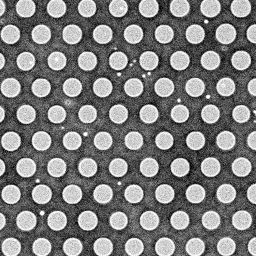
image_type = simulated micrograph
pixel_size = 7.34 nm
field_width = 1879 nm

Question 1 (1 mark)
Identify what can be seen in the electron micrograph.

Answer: an array of small figures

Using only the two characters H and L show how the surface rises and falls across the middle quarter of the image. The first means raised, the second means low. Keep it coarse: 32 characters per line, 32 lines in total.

LLLLHHHHLLLLHHHLLLLHHHHLLLLHHHHL
LLLLLLLLLLLLLLLLLLLLLLLLLLLLLLLL
LLLLLLLLLLLLLLLLLLLLLLLLLLLLLLLL
LLLLLLLLLLLLLLLLLLLLLLLLLLLLLLLL
HHHHLLLLHHHHLLLLHHHLLLLHHHHLLLLH
HHHHLLLHHHHHLLLHHHHHLLLHHHHLLLLH
HHHHLLLHHHHHLLLHHHHHLLLHHHHLLLLH
LHHHLLLLHHHLLLLLHHHLLLLLHHHLLLLH
LLLLLLLLLLLLLLLLLLLLLLLLLLLLLLLL
LLLLLLLLLLLLLLLLLLLLLLLLLLLLLLLL
LLLLLHHLLLLLLHHLLLLLHHLLLLLLHHLL
LLLLHHHHLLLLHHHHLLLHHHHLLLLHHHHL
LLLLHHHHLLLLHHHHLLLHHHHLLLLHHHHL
LLLLHHHHLLLLHHHHLLLHHHHLLLLHHHHL
LLLLLHHLLLLLLHHLLLLLHHLLLLLLHHLL
LLLLLLLLLLLLLLLLLLLLLLLLLLLLLLLL
LLLLLLLLLLLLLLLLLLLLLLLLLLLLLLLL
LHHLLLLLHHHLLLLLHHHLLLLLHHLLLLLH
HHHHLLLLHHHHLLLHHHHHLLLHHHHLLLLH
HHHHLLLLHHHHLLLHHHHHLLLHHHHLLLLH
HHHHLLLLHHHHLLLLHHHLLLLHHHHLLLLH
LLLLLLLLLLLLLLLLLLLLLLLLLLLLLLLL
LLLLLLLLLLLLLLLLLLLLLLLLLLLLLLLL
LLLLLLLLLLLLLLLLLLLLLLLLLLLLLLLL
LLLLHHHHLLLLHHHLLLLLHHHLLLLHHHHL
LLLLHHHHLLLHHHHHLLLHHHHHLLLHHHHL
LLLLHHHHLLLHHHHHLLLHHHHLLLLHHHHL
LLLLHHHLLLLLHHHLLLLLHHHLLLLLHHHL
LLLLLLLLLLLLLLLLLLLLLLLLLLLLLLLL
LLLLLLLLLLLLLLLLLLLLLLLLLLLLLLLL
LHHLLLLLLHHLLLLLHHLLLLLLHHLLLLLL
HHHHLLLLHHHHLLLHHHHHLLLHHHHLLLLH